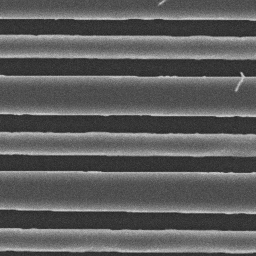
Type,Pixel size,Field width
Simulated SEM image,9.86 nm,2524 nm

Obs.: lines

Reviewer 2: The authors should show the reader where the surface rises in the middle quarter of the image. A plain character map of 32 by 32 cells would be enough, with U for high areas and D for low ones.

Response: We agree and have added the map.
DDDDDDDDDDDDDDDDDDDDDDDDDDDDDDDD
DDDDDDDDDDDDDDDDDDDDDDDDDDDDDDDD
DDDDDDDDDDDDDDDDDDDDDDDDDDDDDDDD
UUUUUUUUUUUUUUUUUUUUUUUUUUUUUUUU
UUUUUUUUUUUUUUUUUUUUUUUUUUUUUUUU
UUUUUUUUUUUUUUUUUUUUUUUUUUUUUUUU
UUUUUUUUUUUUUUUUUUUUUUUUUUUUUUUU
UUUUUUUUUUUUUUUUUUUUUUUUUUUUUUUU
UUUUUUUUUUUUUUUUUUUUUUUUUUUUUUUU
UUUUUUUUUUUUUUUUUUUUUUUUUUUUUUUU
UUUUUUUUUUUUUUUUUUUUUUUUUUUUUUUU
UUUUUUUUUUUUUUUUUUUUUUUUUUUUUUUU
UUUUUUUUUUUUUUUUUUUUUUUUUUUUUUUU
DDDDDDDDDDDDDDDDDDDDDDDDDDDDDDDD
DDDDDDDDDDDDDDDDDDDDDDDDDDDDDDDD
DDDDDDDDDDDDDDDDDDDDDDDDDDDDDDDD
DDDDDDDDDDDDDDDDDDDDDDDDDDDDDDDD
UUDDDUUUUUUUDDUDDDDDDDDDDDDDDDDD
UUUUUUUUUUUUUUUUUUUUUUUUUUUUUUUU
UUUUUUUUUUUUUUUUUUUUUUUUUUUUUUUU
UUUUUUUUUUUUUUUUUUUUUUUUUUUUUUUU
UUUUUUUUUUUUUUUUUUUUUUUUUUUUUUUU
UUDDUUUUUUUUUUDDDDUUUUUUUUUUUUUU
DDDDDDDDDDDDDDDDDDDDDDDDDDDDDDDD
DDDDDDDDDDDDDDDDDDDDDDDDDDDDDDDD
DDDDDDDDDDDDDDDDDDDDDDDDDDDDDDDD
DDDDDDDDDDDDDDDDDDDDDDDDDDDDDDDD
UUUUUUUUUUUUUUUUUUUUUUUUUUUUUUUU
UUUUUUUUUUUUUUUUUUUUUUUUUUUUUUUU
UUUUUUUUUUUUUUUUUUUUUUUUUUUUUUUU
UUUUUUUUUUUUUUUUUUUUUUUUUUUUUUUU
UUUUUUUUUUUUUUUUUUUUUUUUUUUUUUUU